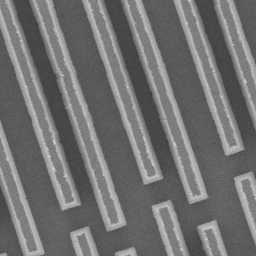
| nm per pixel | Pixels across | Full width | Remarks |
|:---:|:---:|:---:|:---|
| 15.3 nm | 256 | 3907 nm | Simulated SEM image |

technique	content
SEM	parallel lines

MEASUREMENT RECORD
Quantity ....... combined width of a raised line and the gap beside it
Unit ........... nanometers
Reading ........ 653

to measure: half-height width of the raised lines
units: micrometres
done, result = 0.242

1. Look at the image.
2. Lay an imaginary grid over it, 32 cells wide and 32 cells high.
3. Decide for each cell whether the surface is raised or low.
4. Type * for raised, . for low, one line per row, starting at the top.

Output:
*...**.....**..***....**...**...
**..***....**...**....***..**...
**...**....***..**.....**...**..
**...**.....**...**....**...**..
.**..***....**...**....***..**..
.**...**....**...**.....**...**.
.**...**.....**..***....**...**.
..**...**....**...**....***..**.
..**...**....**...**.....**...**
..**...**.....**...**....**...**
...**...**....**...**....***..**
...**...**....**...**.....**...*
...**...**.....**...**....**...*
....**..***....**...**.....**..*
....**...**....**...**.....**...
....**...**.....**..***....**...
.....**...**....**...**.....**..
*....**...**.....*...**.....**..
*....**...**.....**...**....**..
*.....**...**....**...**........
**....**...**....**...**........
**....**...**.....**...**.......
**.....**...**....*....**.....**
***....**...**.........**.....**
.**....***..**..........*.....**
.**.....*....**................*
.***.........**....***.........*
..**.........**.....**.........*
..**................**...**.....
...**....**.........***..**.....
...**....***.........**...**....
...**.....**.........**...**....